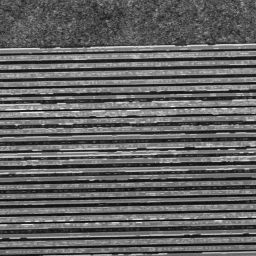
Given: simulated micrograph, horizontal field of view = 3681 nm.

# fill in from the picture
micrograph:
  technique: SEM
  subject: parallel lines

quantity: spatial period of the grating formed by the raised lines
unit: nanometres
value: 116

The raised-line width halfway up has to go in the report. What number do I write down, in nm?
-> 64.7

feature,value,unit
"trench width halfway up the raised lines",3.62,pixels